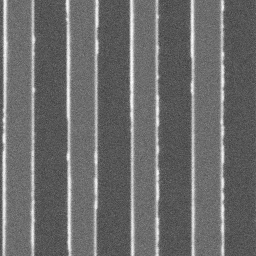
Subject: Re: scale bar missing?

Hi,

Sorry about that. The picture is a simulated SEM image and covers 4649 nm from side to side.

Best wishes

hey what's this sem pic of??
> lines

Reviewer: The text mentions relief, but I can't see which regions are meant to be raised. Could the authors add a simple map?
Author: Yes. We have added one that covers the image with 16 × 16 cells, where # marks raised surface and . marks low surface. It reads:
##..##..##..##..
##..##..##..##..
##..##..##..##..
##..##..##..##..
##..##..##..##..
##..##..##..##..
##..##..##..##..
##..##..##..##..
##..##..##..##..
##..##..##..##..
##..##..##..##..
##..##..##..##..
##..##..##..##..
##..##..##..##..
##..##..##..##..
##..##..##..##..